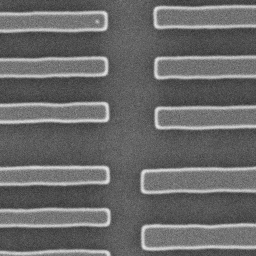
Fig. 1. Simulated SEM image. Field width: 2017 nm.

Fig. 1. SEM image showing groups of lines, slits or small figures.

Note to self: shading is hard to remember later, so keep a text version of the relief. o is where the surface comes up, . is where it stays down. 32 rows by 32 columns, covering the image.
................................
...................ooooooooooooo
ooooooooooooo......ooooooooooooo
ooooooooooooo...................
................................
................................
................................
ooooooooooooo.......oooooooooooo
ooooooooooooo......ooooooooooooo
ooooooo.............oooooooooooo
................................
................................
................................
ooooooooooooo.........oooooooooo
ooooooooooooo.......oooooooooooo
....................oooooooooooo
................................
................................
................................
................................
................................
ooooooooooooo.....oooooooooooooo
ooooooooooooo.....oooooooooooooo
..................oooooooooooooo
................................
................................
ooooooooooooo...................
oooooooooooooo..................
..................oooooooooooooo
..................oooooooooooooo
..................oooooooooooooo
.....oooooooo...................